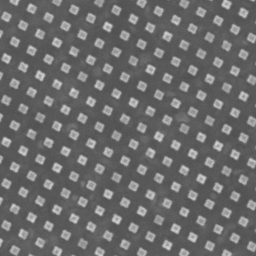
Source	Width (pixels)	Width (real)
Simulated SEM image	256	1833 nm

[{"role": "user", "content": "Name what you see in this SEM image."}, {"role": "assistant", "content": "a regular array of raised bodies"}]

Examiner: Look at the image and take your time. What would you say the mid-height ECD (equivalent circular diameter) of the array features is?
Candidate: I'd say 62.6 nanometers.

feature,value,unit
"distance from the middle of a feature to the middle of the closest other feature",0.133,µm